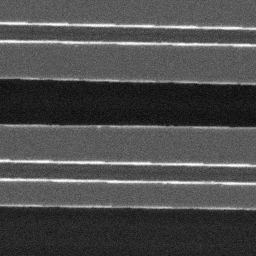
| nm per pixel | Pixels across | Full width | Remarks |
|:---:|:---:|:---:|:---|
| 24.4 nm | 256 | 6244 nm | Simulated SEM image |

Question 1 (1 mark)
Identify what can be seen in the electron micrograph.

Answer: lines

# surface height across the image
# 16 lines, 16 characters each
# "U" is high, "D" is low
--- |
UUUUUUUUUUUUUUUU
UUUUUUUUUUUUUUUU
UUUUUUUUUUUUUUUU
UUUUUUUUUUUUUUUU
UUUUUUUUUUUUUUUU
DDDDDDDDDDDDDDDD
DDDDDDDDDDDDDDDD
DDDDDDDDDDDDDDDD
UUUUUUUUUUUUUUUU
UUUUUUUUUUUUUUUU
UUUUUUUUUUUUUUUU
UUUUUUUUUUUUUUUU
UUUUUUUUUUUUUUUU
DDDDDDDDDDDDDDDD
DDDDDDDDDDDDDDDD
DDDDDDDDDDDDDDDD